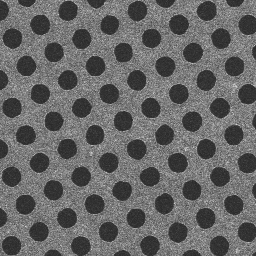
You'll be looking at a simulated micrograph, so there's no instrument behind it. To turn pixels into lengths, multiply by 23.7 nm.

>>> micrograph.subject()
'a regular array of holes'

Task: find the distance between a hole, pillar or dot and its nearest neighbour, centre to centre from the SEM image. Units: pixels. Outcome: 30.7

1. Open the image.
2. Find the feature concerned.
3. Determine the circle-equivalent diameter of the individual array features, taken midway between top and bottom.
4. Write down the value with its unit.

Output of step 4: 473 nanometers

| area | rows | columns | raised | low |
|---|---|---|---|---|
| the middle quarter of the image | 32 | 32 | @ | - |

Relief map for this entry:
@@@@@------@@@@@@@@@@@@-----@@@@
@@@@@@----@@@@@@@@-@@@@-----@@@@
---@@@----@@@@@@----@@@@---@@@@@
---@@@@@@@@@@@@@-----@@@@@@@@@@@
---@@@@@@@@@@@@@-----@@@@@@@@@@@
---@@@@@@@---@@@----@@@@@@@---@@
-@@@@@@@@-----@@@--@@@@@@@-----@
@@@@@@@@@-----@@@@@@@@@@@@-----@
@@@@-@@@@-----@@@@@@@-@@@@-----@
@@@---@@@@---@@@@@@@---@@@@---@@
@@-----@@@@@@@@@@@@-----@@@@@@@@
@@-----@@@@@@@@@@@@-----@@@@@@@@
@@----@@@@@@@----@@@----@@@@@@--
@@@@@@@@@@@@-----@@@@--@@@@@@@--
@@@@@@@@@@@@-----@@@@@@@@@@@@---
@@@@@@@--@@@@----@@@@@@@--@@@@--
@@@@@@----@@@@--@@@@@@@----@@@@-
@@@@@-----@@@@@@@@@@@@@-----@@@@
@@@@@-----@@@@@@@@@@@@@----@@@@@
---@@@----@@@@@@----@@@----@@@@@
---@@@@@@@@@@@@@-----@@@@@@@@@@@
---@@@@@@@@@@@@@-----@@@@@@@@@@@
---@@@@@@@--@@@@----@@@@@@@---@@
--@@@@@@@----@@@@---@@@@@@-----@
@@@@@@@@@-----@@@@@@@@@@@@-----@
@@@@@@@@@-----@@@@@@@@@@@@-----@
@@----@@@@---@@@@@@@---@@@@---@@
@@-----@@@@@@@@@@@@-----@@@@@@@@
@@-----@@@@@@@@@@@@-----@@@@@@@@
@@----@@@@@@@---@@@-----@@@@@@--
@@@--@@@@@@@-----@@@@-@@@@@@@@--
@@@@@@@@@@@@-----@@@@@@@@@@@@@--